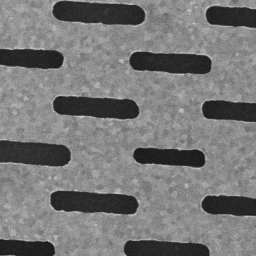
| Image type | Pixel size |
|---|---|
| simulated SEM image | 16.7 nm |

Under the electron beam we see holes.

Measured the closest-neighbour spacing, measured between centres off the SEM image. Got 1470 nm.